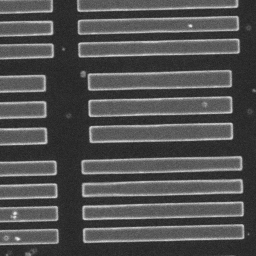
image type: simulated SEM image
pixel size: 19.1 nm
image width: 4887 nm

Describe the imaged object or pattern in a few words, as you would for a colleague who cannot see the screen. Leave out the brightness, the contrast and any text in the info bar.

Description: groups of lines, slits or small figures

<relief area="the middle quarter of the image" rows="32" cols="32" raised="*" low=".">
................................
................................
....*.........******************
......**************************
......**************************
......**************************
................................
................................
................................
......**************************
......**************************
......**************************
......************************..
................................
................................
..........**********************
......**************************
.......*************************
.......*************************
.......****.....................
................................
................................
................................
................................
.....***************************
.....***************************
.....***************************
................................
................................
.......................*********
.....***************************
.....***************************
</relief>